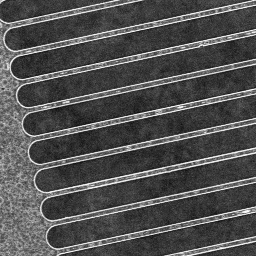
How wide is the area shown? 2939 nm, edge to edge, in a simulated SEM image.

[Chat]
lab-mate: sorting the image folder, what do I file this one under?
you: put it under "parallel lines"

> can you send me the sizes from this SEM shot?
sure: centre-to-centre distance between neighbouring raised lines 0.332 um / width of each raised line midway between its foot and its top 4.9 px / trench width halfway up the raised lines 23.7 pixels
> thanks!